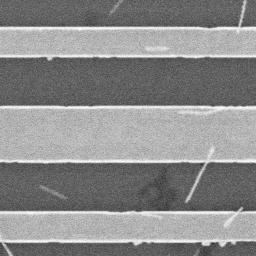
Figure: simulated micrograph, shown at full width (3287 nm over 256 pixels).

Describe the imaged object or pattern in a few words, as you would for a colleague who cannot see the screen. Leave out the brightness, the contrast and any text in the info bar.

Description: lines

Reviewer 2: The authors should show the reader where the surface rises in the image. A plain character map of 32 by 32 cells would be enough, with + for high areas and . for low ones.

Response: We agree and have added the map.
................................
................................
................................
.............................++.
++++++++++++++++++++++++++++++++
++++++++++++++++++++++++++++++++
++++++++++++++++++++++++++++++++
................................
................................
................................
................................
................................
................................
++++++++++++++++++++++++++++++++
++++++++++++++++++++++++++++++++
++++++++++++++++++++++++++++++++
++++++++++++++++++++++++++++++++
++++++++++++++++++++++++++++++++
++++++++++++++++++++++++++++++++
++++++++++++++++++++++++++++++++
................................
................................
................................
................................
................................
................................
................+............++.
++++++++++++++++++++++++++++++++
++++++++++++++++++++++++++++++++
++++++++++++++++++++++++++++++++
................................
................................